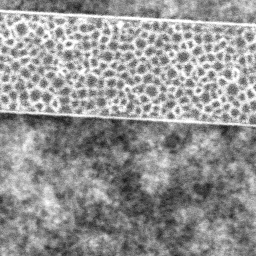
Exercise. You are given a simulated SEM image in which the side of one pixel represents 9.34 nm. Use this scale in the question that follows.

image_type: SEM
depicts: one or a few lines or trenches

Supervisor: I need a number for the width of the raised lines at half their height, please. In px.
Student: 100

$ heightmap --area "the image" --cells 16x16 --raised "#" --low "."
................
###############.
################
################
################
################
################
..........######
................
................
................
................
................
................
................
................